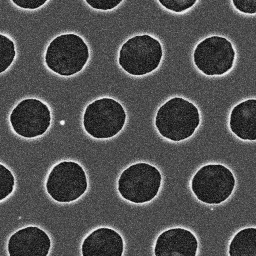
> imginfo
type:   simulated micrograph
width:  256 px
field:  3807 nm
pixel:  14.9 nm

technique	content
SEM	a regular array of holes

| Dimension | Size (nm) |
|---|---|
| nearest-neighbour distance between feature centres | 1090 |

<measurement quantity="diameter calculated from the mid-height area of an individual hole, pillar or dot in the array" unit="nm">614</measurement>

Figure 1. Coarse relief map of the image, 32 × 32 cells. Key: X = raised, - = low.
XX---XXXXXX----XXXXX----XXXXX---
XXXXXXXXXXXXXXXXXXXXXX-XXXXXXX--
XXXXXXXXXXXXXXXXXXXXXXXXXXXXXXXX
XXXXXXXXXXXXXXXXXXXXXXXXXXXXXXXX
-XXXXXX---XXXXXXX--XXXXXXXXXXXXX
--XXXX-----XXXXX----XXXXX----XXX
--XXXX-----XXXX-----XXXX-----XXX
--XXXX-----XXXX-----XXXX-----XXX
-XXXXX----XXXXX----XXXXXX----XXX
XXXXXXXXXXXXXXXXXXXXXXXXXXXXXXXX
XXXXXXXXXXXXXXXXXXXXXXXXXXXXXXXX
XXXXXXXXXXXXXXXXXXXXXXXXXXXXXXXX
XXX--XXXXXXX--XXXXXXX--XXXXXXXX-
XX----XXXXX----XXXXX-----XXXX---
X-----XXXXX-----XXXX-----XXXX---
X-----XXXX------XXX------XXXX---
XX----XXXXX----XXXXX----XXXXX---
XXXXXXXXXXXXXXXXXXXXX--XXXXXXXX-
XXXXXXXXXXXXXXXXXXXXXXXXXXXXXXXX
XXXXXXXXXXXXXXXXXXXXXXXXXXXXXXXX
XXXXXXX---XXXXXXX-XXXXXXXXXXXXXX
-XXXXX-----XXXX-----XXXXX----XXX
--XXXX-----XXXX-----XXXX-----XXX
--XXXX-----XXXX-----XXXX-----XXX
-XXXXX----XXXXX----XXXXXX----XXX
XXXXXXXXXXXXXXXXXXXXXXXXXXXXXXXX
XXXXXXXXXXXXXXXXXXXXXXXXXXXXXXXX
XXXXXXXXXXXXXXXXXXXXXXXXXXXXXXXX
XXX--XXXXXXXXXXXXXXXXXXXXXXXXXX-
XX----XXXXX----XXXXX----XXXXX---
X-----XXXX-----XXXX------XXXX---
X-----XXXX-----XXXX------XXXX---